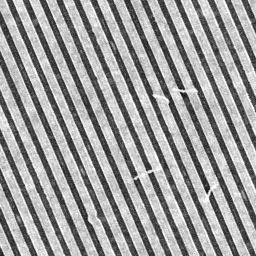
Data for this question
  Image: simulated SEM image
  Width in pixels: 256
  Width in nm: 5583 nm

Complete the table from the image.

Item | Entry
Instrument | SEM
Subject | parallel lines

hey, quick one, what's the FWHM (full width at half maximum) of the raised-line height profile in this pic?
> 178 nm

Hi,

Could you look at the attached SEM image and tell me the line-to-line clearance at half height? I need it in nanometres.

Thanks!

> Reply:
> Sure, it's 158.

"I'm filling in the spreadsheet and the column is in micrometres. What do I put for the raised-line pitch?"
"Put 0.337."